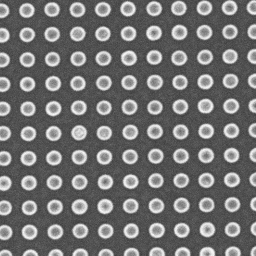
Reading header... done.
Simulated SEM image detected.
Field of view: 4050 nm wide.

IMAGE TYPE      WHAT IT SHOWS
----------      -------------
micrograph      a regular array of raised bodies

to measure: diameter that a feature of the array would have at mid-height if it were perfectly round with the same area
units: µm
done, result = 0.214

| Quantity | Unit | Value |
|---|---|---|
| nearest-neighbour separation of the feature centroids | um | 0.387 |